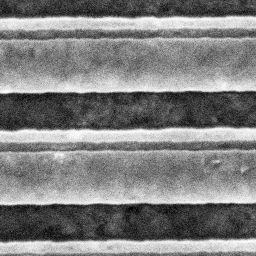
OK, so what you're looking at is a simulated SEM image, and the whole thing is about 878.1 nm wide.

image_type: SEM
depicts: lines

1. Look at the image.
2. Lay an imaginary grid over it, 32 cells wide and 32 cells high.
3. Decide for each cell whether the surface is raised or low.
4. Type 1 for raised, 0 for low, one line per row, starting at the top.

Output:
00000000000000000000000000000000
00000000000000000000000000000000
11111111111111111111111111111111
11111111111111111111111111111111
11111111111111111111111111111111
11111111111111111111111111111111
11111111111111111111111111111111
11111111111111111111111111111111
11111111111111111111111111111111
11111111111111111111111111111111
11111111111111111111111111111111
11111000011000000000000000000000
00000000000000000000000000000000
00000000000000000000000000000000
00000000000000000000000000000000
00000000000000000000000000000000
00111111111111111111111111111111
11111111111111111111111111111111
11111111111111111111111111111111
11111111111111111111111111111111
11111111111111111111111111111111
11111111111111111111111111111111
11111111111111111111111111111111
11111111111111111111111111111111
11111111111111111111111111111111
11000000000000000000000000000000
00000000000000000000000000000000
00000000000000000000000000000000
00000000000000000000000000000000
00000000000000000000000000000000
11111111111111111111111111111111
11111111111111111111111111111111